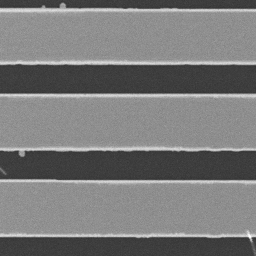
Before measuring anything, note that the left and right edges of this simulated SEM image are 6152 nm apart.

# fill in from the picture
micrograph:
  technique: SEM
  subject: lines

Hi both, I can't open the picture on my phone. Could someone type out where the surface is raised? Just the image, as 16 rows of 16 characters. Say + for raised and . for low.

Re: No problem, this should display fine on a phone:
................
++++++++++++++++
++++++++++++++++
++++++++++++++++
................
................
++++++++++++++++
++++++++++++++++
++++++++++++++++
................
................
++++++++++++++++
++++++++++++++++
++++++++++++++++
++++++++++++++++
................